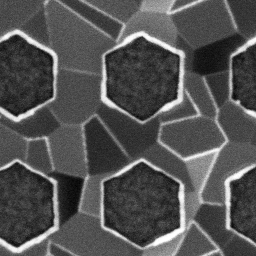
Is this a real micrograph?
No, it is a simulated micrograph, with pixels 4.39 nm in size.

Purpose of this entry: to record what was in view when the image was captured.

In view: holes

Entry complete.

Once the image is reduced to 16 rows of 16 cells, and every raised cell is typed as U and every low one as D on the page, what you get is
UUUUUUUUUUUUUUUU
UUUUUUUUUUUUUUUU
DDUUUUUUDUUUUUUU
DDDUUUUDDDDUUUUD
DDDUUUUDDDDUUUDD
DDDUUUUDDDDUUUDD
DDDUUUUDDDDUUUUD
UUUUUUUUUUUUUUUU
UUUUUUUUUUUUUUUU
UUUUUUUUUUUUUUUU
DDUUUUUUDDUUUUUU
DDDUUUUDDDDUUUDD
DDDUUUDDDDDUUUDD
DDDUUUDDDDDUUUDD
DDDUUUUDDDDUUUUD
UUUUUUUUUUUUUUUU